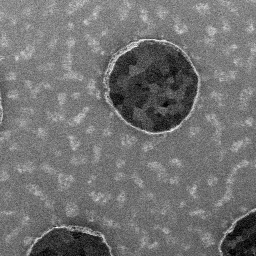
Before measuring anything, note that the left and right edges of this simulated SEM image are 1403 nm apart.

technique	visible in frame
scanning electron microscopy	raised bodies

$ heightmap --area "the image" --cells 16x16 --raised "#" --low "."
................
................
.........#......
.......#####....
.......#####....
.......#####....
.......#####....
........####....
................
................
................
................
................
...............#
...###........##
..#####.......##